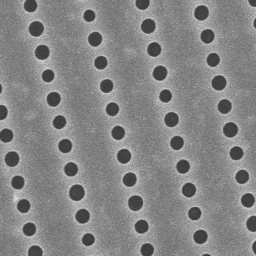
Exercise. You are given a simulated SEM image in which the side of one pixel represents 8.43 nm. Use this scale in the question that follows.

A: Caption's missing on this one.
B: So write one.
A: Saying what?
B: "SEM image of a regular array of holes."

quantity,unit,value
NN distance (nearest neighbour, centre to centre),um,0.203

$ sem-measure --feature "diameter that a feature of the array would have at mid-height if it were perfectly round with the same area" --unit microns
0.123